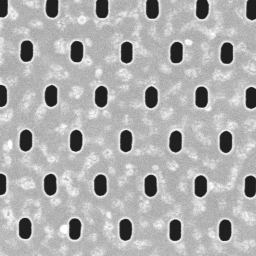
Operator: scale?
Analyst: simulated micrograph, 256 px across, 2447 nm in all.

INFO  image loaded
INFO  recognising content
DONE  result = a regular array of holes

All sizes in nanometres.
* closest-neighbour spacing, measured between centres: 477